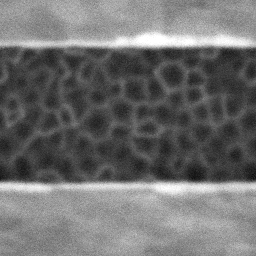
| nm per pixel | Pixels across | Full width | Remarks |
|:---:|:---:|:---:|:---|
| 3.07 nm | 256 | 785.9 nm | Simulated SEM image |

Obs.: one or a few lines or trenches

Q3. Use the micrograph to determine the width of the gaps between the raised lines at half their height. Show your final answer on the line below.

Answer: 0.429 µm